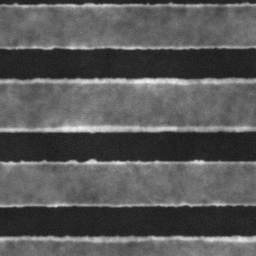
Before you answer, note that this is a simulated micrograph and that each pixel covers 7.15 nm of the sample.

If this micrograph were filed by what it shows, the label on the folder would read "lines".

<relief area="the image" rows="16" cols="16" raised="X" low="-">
XXXXXXXXXXXXXXXX
XXXXXXXXXXXXXXXX
XXXXXXXXXXXXXXXX
----------------
----------------
XXXXXXXXXXXXXXXX
XXXXXXXXXXXXXXXX
XXXXXXXXXXXXXXXX
----------------
----------------
XXXXXXXXXXXXXXXX
XXXXXXXXXXXXXXXX
XXXXXXXXXXXXXXXX
----------------
----------------
XXXXXXXXXXXXXXXX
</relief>